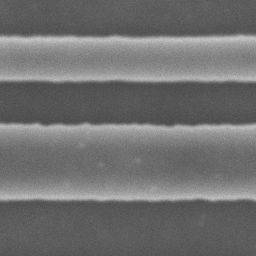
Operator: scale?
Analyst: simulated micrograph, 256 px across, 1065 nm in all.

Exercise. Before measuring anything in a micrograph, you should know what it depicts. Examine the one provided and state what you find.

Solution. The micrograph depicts lines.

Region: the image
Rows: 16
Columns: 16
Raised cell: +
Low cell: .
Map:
................
................
++++++++++++++++
++++++++++++++++
++++++++++++++++
................
................
................
++++++++++++++++
++++++++++++++++
++++++++++++++++
++++++++++++++++
......+.+++..+..
................
................
................